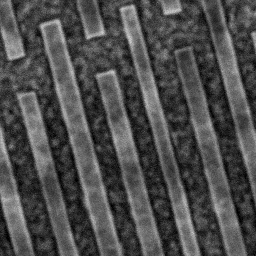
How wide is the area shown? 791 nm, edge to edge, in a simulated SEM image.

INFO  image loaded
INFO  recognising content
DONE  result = parallel lines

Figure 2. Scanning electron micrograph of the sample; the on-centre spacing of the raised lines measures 126 nm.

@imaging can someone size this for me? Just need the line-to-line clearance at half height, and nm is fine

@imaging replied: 71.6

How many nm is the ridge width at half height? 52.2